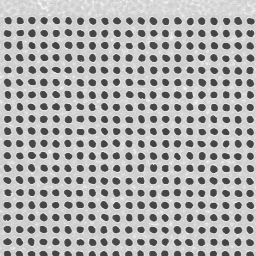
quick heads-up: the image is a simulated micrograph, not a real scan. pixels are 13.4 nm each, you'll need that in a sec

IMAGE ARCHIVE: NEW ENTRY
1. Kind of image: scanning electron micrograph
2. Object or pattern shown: a regular array of holes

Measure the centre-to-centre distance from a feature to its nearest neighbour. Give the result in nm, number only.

156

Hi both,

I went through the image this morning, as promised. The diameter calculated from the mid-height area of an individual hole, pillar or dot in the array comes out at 99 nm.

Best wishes